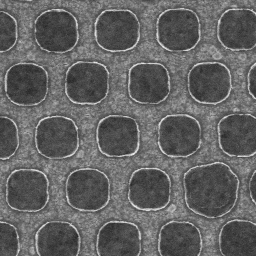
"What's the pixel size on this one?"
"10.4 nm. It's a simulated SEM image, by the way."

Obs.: a regular array of raised bodies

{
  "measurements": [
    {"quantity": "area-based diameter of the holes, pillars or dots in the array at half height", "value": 44.4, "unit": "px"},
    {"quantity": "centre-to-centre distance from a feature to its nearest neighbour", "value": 631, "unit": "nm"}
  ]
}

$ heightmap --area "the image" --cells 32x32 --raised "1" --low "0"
00000000000000000000000000000000
00000011000001110000011100001111
11000111100011111000111110011111
11001111110011111000111110011111
11001111110011111000111110011111
11000111100011111000111110001111
00000000000000000000000000000000
00000000000000000000000000000000
01111000011110001111100011110001
01111100111111001111100011111001
01111100111110001111100011111001
01111100111110001111100011111001
01111000011110000111000001110000
00000000000000000000000000000000
00000000000000000000011100000111
11000111100011111000111110011111
11000111110011111000111110011111
11001111110011111000111110011111
11000111110011111000111110001111
10000111100000000000011100000010
00000000000000000000000000110000
00111000011110000111000111111000
01111100111111001111100111111101
01111100111111001111100111111101
01111100111111001111100111111101
01111100011110000111100111111000
00000000000000000000000011110000
00000000000000000000000000000000
11000111100001111000111110001111
11000111110011111100111110001111
11000111110011111100111110011111
11000111110011111100111110001111